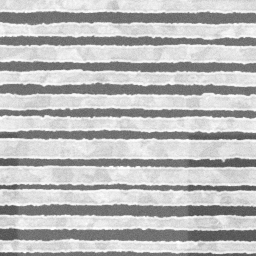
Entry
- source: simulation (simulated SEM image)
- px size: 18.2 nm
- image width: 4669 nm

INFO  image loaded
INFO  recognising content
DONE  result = parallel lines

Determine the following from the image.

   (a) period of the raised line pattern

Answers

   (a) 439 nm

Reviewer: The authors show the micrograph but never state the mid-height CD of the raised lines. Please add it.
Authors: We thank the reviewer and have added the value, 235 nm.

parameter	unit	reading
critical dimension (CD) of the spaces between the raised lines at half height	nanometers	203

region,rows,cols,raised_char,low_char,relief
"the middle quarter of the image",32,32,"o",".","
................................
................................
oooooooooooooooooooooooooooooooo
oooooooooooooooooooooooooooooooo
oooooooo.oo.oooooooooooooooooooo
................................
................................
................................
oooooooooooooooooooooooooooooooo
oooooooooooooooooooooooooooooooo
oooooooooooooooooooooooooooooooo
................................
................................
..............oo................
oooooooooooooooooooooooooooooooo
oooooooooooooooooooooooooooooooo
....................oo..o.oooooo
................................
................................
oooooooooooooooooooooooooooooooo
oooooooooooooooooooooooooooooooo
oooooooooooooooooooooooooooooooo
oooooooooooooooooooooooooooooooo
.....oo.........................
................................
................................
oooooooooooooooooooooooooooooooo
oooooooooooooooooooooooooooooooo
oooooooooooooooooooooooooooooooo
oooooooooooooooooooooooooooooooo
................................
................................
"